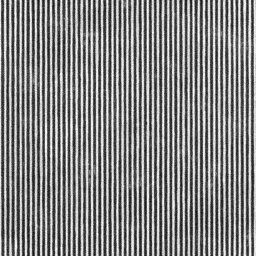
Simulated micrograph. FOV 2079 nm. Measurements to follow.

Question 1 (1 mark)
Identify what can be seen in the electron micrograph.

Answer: parallel lines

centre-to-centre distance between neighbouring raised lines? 41.3 nm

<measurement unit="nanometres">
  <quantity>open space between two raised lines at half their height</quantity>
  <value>27.4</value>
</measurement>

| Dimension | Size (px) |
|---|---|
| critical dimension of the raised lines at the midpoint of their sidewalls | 1.5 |